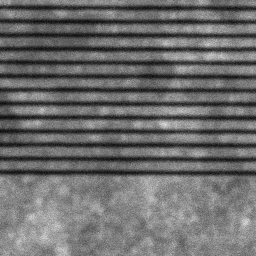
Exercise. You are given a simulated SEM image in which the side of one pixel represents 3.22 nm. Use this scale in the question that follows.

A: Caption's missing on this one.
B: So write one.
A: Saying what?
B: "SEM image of parallel lines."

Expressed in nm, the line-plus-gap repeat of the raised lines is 44.2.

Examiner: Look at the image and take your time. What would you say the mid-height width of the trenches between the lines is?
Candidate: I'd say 17.3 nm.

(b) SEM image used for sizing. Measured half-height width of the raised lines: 8.14 pixels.